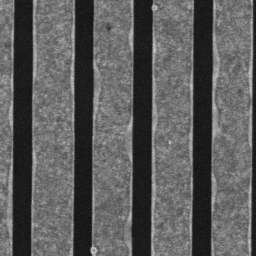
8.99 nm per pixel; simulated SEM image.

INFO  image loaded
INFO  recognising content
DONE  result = wiring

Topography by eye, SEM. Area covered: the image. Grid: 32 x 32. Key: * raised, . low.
**..*****...****...*****...*****
**..*****...****...*****...*****
**..*****...*****..*****...*****
**..*****...****...*****...****.
**..*****...****...*****...****.
**..*****...****...*****...****.
**..*****...*****..*****...****.
**..*****...*****..*****...****.
**..*****...*****..*****...****.
**..*****...*****..*****...****.
*...*****...*****..*****...****.
**..*****...****...*****...****.
**..*****...****...*****...****.
*...*****...****...*****...****.
*...*****...****...*****...****.
*...*****...****...*****...****.
**..*****...****...*****...****.
**..*****...****...*****...****.
**..*****...****...*****...****.
*...*****...****...*****...****.
*...*****...****...*****...****.
*...*****...****...*****...****.
*...*****...****...*****...****.
*...*****...****...*****...****.
*...*****...****...*****...****.
*...*****...****...*****...****.
*...*****...****...*****...****.
*...*****...****...*****...****.
*...*****...****...*****...****.
*...*****...****...*****...****.
*...*****...****...*****...****.
*...*****..*****...*****...****.